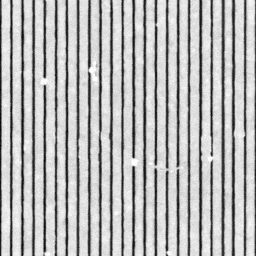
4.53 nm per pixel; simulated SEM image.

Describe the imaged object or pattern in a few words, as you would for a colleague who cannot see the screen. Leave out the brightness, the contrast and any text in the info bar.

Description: parallel lines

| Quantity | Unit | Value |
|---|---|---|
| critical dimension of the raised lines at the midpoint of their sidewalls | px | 8.12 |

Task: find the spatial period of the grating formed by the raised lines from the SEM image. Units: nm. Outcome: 50.4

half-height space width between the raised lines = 0.0125 µm